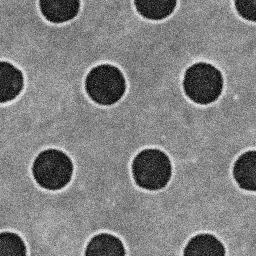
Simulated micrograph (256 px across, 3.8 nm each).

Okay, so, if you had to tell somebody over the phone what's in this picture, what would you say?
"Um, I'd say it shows holes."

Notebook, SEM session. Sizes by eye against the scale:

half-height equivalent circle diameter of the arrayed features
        163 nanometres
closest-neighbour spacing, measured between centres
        369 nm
